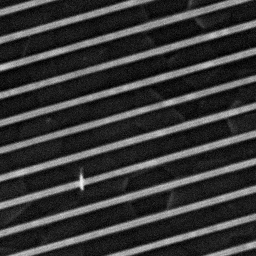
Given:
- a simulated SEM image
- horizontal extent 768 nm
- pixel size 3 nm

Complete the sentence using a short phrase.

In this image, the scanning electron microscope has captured parallel lines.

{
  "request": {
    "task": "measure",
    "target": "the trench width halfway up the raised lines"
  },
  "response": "0.0643 um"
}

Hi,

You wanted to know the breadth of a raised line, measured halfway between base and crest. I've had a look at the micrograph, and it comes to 15.9 nm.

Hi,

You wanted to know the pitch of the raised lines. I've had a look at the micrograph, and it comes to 0.0798 microns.